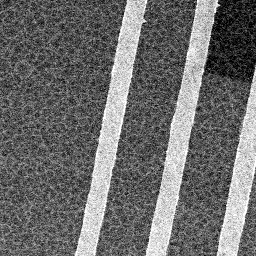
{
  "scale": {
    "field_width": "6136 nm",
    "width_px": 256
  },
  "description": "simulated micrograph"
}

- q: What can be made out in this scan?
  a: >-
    one or a few lines or trenches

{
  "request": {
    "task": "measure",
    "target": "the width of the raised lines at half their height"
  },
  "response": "446 nm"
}